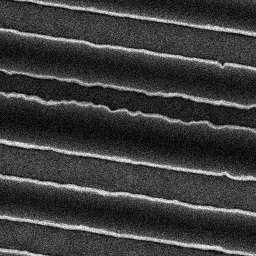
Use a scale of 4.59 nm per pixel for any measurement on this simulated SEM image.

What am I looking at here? one or a few lines or trenches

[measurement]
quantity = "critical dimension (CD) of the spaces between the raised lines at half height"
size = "146 nanometers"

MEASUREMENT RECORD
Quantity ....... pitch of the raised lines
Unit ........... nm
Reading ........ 331